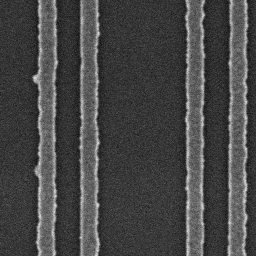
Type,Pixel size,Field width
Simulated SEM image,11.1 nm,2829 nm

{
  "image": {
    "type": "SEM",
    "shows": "lines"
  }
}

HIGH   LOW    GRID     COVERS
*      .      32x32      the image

.....**...**...........**....**.
.....**...**...........**....**.
.....**...**...........**....**.
.....**...**...........**....**.
.....**...**...........**....**.
.....**...**...........**....**.
.....**...**...........**....**.
.....**...**...........***...**.
.....**...**...........**....**.
....***...**...........**....**.
.....**...**...........**....**.
.....**...**...........**....**.
.....**...**...........**....**.
.....**...**...........**....**.
.....**...**...........**....**.
.....**...**...........**....**.
.....**...**...........**....**.
.....**...**...........**....**.
.....**...**...........**....**.
.....**...**...........**....**.
.....**...**...........**....**.
....***...**...........**....**.
.....**...**...........**....**.
.....**...**...........**....**.
.....**...**...........**....**.
.....**...**...........**....**.
.....**...**...........**....**.
.....**...**...........**....**.
.....**...**...........**....**.
.....**...**...........**....**.
.....**...**...........**....**.
.....**...**...........**....**.